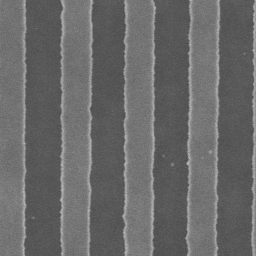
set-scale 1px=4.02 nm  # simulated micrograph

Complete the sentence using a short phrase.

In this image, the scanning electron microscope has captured lines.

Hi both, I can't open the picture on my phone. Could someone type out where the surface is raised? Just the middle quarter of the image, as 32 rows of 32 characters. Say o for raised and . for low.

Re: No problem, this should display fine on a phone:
ooooooo........oooooooo........o
ooooooo........ooooooo.........o
ooooooo........oooooooo........o
ooooooo........ooooooo.........o
ooooooo........ooooooo.........o
ooooooo........ooooooo.........o
ooooooo........ooooooo.........o
ooooooo........oooooooo........o
ooooooo........oooooooo........o
ooooooo........ooooooo.........o
ooooooo........oooooooo........o
ooooooo........oooooooo........o
ooooooo........ooooooo.........o
ooooooo........oooooooo........o
ooooooo........ooooooo.........o
ooooooo........ooooooo.........o
ooooooo........ooooooo.........o
ooooooo........ooooooo.........o
ooooooo........oooooooo........o
ooooooo........oooooooo........o
ooooooo........oooooooo........o
ooooooo........oooooooo........o
ooooooo........ooooooo.........o
ooooooo........ooooooo.........o
ooooooo........ooooooo.........o
ooooooo........ooooooo.........o
ooooooo........ooooooo.........o
ooooooo........ooooooo.........o
oooooo.........ooooooo.........o
oooooo.........ooooooo.........o
ooooooo........ooooooo.........o
ooooooo........ooooooo.........o